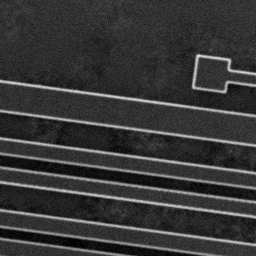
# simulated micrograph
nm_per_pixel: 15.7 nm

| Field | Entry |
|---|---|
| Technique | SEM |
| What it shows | groups of lines, slits or small figures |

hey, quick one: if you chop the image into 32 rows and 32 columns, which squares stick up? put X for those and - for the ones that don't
--------------------------------
--------------------------------
--------------------------------
--------------------------------
--------------------------------
--------------------------------
--------------------------------
-------------------------XXX----
------------------------XXXXX---
------------------------XXXXXXXX
XXX---------------------XXXXX-XX
XXXXXXXXXX----------------------
XXXXXXXXXXXXXXXXX---------------
XXXXXXXXXXXXXXXXXXXXXXXXX-------
----XXXXXXXXXXXXXXXXXXXXXXXXXXXX
------------XXXXXXXXXXXXXXXXXXXX
-------------------XXXXXXXXXXXXX
XX-------------------------XXXXX
XXXXXXXXX-----------------------
--XXXXXXXXXXXXXX----------------
---------XXXXXXXXXXXXXXX--------
XXXX-------------XXXXXXXXXXXXXX-
XXXXXXXXXXXX------------XXXXXXXX
-----XXXXXXXXXXXXXX------------X
------------XXXXXXXXXXXXXX------
-------------------XXXXXXXXXXXXX
XX-------------------------XXXXX
XXXXXXXXX-----------------------
-XXXXXXXXXXXXXXXX---------------
---------XXXXXXXXXXXXXXX--------
XXXXX-----------XXXXXXXXXXXXXXX-
XXXXXXXXXXXX-----------XXXXXXXXX